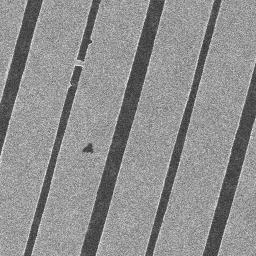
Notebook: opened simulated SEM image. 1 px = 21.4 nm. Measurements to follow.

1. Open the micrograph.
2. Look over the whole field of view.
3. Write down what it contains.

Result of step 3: parallel lines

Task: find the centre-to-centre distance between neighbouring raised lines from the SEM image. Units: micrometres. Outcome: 1.25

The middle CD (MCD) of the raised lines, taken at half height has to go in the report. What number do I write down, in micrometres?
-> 1.01